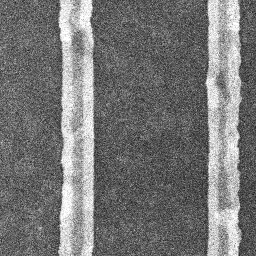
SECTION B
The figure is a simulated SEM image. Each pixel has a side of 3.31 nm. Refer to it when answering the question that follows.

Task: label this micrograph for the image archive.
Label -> one or a few lines or trenches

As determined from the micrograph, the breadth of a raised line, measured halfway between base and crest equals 74.5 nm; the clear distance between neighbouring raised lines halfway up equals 0.408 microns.